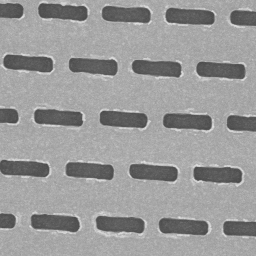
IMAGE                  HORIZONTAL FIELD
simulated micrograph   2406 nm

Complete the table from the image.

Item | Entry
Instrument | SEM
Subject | a regular array of holes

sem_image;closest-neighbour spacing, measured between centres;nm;575